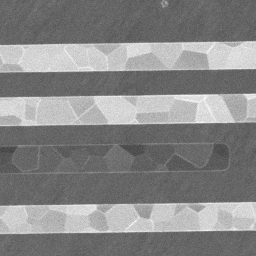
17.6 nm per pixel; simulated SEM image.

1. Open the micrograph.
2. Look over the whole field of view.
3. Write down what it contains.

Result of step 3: groups of lines, slits or small figures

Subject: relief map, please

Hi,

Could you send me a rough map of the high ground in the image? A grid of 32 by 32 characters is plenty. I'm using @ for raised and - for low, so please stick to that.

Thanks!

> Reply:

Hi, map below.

--------------------@-----------
--------------------------------
--------------------------------
--------------------------------
--------------------------------
--------------@@@@@@@@@@@@@@@@@@
@@@@@@@@@@@@@@@@@@@@@@@@@@@@@@@@
@@@@@@@@@@@@@@@@@@@@@@@@@@@@@@@@
@@@@@@@@@@@@@@@@@@@@@@@@@@@@@@@@
--------------------------------
--------------------------------
--------------------------------
@@@@@@@@@@@@@@@@@@@@@@@@@@@@@@@@
@@@@@@@@@@@@@@@@@@@@@@@@@@@@@@@@
@@@@@@@@@@@@@@@@@@@@@@@@@@@@@@@@
@@@@@@@@@@@---------------------
--------------------------------
--------------------------------
@@@@@@@@@@@@@@@@@@@@@@@@@@@@@---
@@@@@@@@@@@@@@@@@@@@@@@@@@@@@---
@@@@@@@@@@@@@@@@@@@@@@@@@@@@@---
@@@@@@@@@@@@@-------------------
--------------------------------
--------------------------------
--------------------------------
------------------------@@@@@@@@
@@@@@@@@@@@@@@@@@@@@@@@@@@@@@@@@
@@@@@@@@@@@@@@@@@@@@@@@@@@@@@@@@
@@@@@@@@@@@@@@@@@@@@@@@@@@@@@@@@
--------------------------------
--------------------------------
--------------------------------